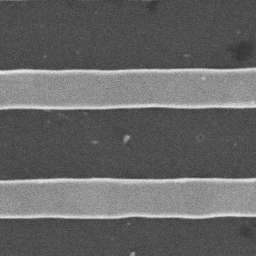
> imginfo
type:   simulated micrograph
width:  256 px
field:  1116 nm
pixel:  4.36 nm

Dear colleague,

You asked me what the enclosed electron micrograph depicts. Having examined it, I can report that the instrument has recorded wiring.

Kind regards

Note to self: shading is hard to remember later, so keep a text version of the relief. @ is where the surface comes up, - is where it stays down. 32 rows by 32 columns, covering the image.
--------------------------------
--------------------------------
--------------------------------
--------------------------------
--------------------------------
--------------------------------
--------------------------------
--------------------------------
--------------------------------
@@@@@@@@@@@@@@@@@@@@@@@@@@@@@@@@
@@@@@@@@@@@@@@@@@@@@@@@@@@@@@@@@
@@@@@@@@@@@@@@@@@@@@@@@@@@@@@@@@
@@@@@@@@@@@@@@@@@@@@@@@@@@@@@@@@
@---@@@@@@@@@@------------------
--------------------------------
--------------------------------
--------------------------------
--------------------------------
--------------------------------
--------------------------------
--------------------------------
--------------------------------
----@@@@@@@@@@@@@@@@@@@@@@@@@@@@
@@@@@@@@@@@@@@@@@@@@@@@@@@@@@@@@
@@@@@@@@@@@@@@@@@@@@@@@@@@@@@@@@
@@@@@@@@@@@@@@@@@@@@@@@@@@@@@@@@
@@@@@@@@@@@@@@@@@@@@@@@@@@@@@@@@
--------------------------------
--------------------------------
--------------------------------
--------------------------------
--------------------------------